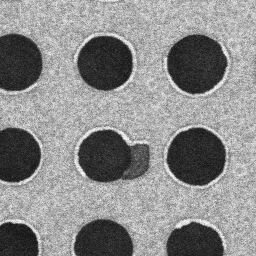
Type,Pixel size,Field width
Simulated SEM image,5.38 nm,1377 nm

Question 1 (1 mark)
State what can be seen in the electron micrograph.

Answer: holes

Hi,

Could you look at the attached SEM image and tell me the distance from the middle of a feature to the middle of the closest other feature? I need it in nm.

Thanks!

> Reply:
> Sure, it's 474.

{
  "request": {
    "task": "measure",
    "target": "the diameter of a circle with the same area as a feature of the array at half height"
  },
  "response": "317 nm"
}